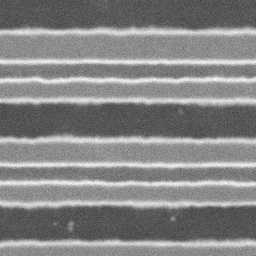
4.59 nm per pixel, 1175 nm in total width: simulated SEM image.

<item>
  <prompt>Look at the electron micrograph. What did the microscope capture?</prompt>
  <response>lines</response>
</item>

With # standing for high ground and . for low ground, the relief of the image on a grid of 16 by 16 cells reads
................
................
################
################
################
################
................
................
................
################
################
################
################
................
................
################